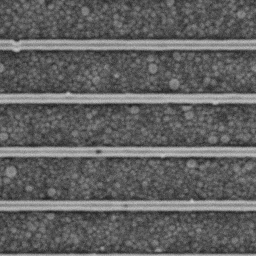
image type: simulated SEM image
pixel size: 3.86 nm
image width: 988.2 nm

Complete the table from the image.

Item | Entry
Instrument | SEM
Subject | parallel lines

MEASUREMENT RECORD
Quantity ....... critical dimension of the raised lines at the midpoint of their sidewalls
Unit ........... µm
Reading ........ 0.028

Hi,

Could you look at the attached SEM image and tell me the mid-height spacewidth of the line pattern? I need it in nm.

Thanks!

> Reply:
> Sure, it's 178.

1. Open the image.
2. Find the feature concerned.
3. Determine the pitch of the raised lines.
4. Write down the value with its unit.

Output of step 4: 207 nm